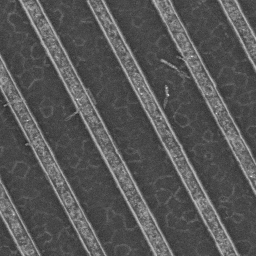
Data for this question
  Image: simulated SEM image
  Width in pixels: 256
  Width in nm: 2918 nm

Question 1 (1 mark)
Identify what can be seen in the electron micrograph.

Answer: parallel lines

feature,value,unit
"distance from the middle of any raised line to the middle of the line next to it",668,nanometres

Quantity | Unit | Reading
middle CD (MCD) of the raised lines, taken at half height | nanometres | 155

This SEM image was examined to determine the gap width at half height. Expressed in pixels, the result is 44.6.